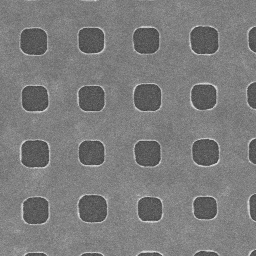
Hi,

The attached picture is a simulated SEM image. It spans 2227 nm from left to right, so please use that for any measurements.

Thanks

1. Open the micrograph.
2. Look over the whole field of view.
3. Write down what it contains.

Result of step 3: a regular array of holes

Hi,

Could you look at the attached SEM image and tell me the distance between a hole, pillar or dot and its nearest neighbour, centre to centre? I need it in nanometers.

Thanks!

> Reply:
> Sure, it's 484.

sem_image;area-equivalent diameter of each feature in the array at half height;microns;0.245